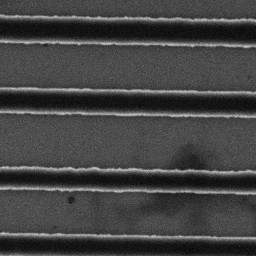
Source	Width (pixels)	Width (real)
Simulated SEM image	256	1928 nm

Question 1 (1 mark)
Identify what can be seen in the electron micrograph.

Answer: lines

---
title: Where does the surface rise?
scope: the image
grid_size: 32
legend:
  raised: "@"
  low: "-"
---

--------------------------------
--------------------------------
@@@@@@@@@@@@@@@@@@@@@@@@@@@@-@@@
@@@@@@@@@@@@@@@@@@@@@@@@@@@@@@@@
@@@@@@@@@@@@@@@@@@@@@@@@@@@@@@@@
---------@--@@@@@@@@@@@@@@@@@@@@
--------------------------------
--------------------------------
--------------------------------
--------------------------------
--------------------------------
@@@@@@@@@@@@@@@@@@@@@@@@@-------
@@@@@@@@@@@@@@@@@@@@@@@@@@@@@@@@
@@@@@@@@@@@@@@@@@@@@@@@@@@@@@@@@
---------------------@@@@@@@@@@@
--------------------------------
--------------------------------
--------------------------------
--------------------------------
--------------------------------
--------------------------------
@@@@@@@@@@@@@@@@@@@@@@@@@@@@@@@@
@@@@@@@@@@@@@@@@@@@@@@@@@@@@@@@@
@@@@@@@@@@@@@@@@@@@@@@@@@@@@@@@@
--------------------------------
--------------------------------
--------------------------------
--------------------------------
--------------------------------
@@@@@@@@@@@@@@@@@@@@------------
@@@@@@@@@@@@@@@@@@@@@@@@@@@@@@@@
@@@@@@@@@@@@@@@@@@@@@@@@@@@@@@@@